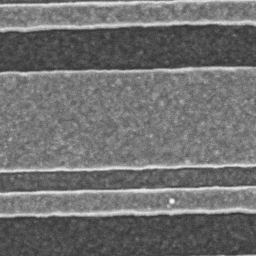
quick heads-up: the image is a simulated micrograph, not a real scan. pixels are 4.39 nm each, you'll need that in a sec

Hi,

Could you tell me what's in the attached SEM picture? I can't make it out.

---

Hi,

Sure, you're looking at lines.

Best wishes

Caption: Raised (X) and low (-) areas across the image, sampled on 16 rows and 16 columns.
XXXXXXXXXXXXXXXX
XXXXXXXXXXX-----
----------------
----------------
---XXXXXXXXXXXXX
XXXXXXXXXXXXXXXX
XXXXXXXXXXXXXXXX
XXXXXXXXXXXXXXXX
XXXXXXXXXXXXXXXX
XXXXXXXXXXXXXXXX
XXXXXXXXXXXXXXXX
XXXXXXXXXXXXXXXX
XXXXXXXXXXXXXXXX
X---------------
----------------
----------------